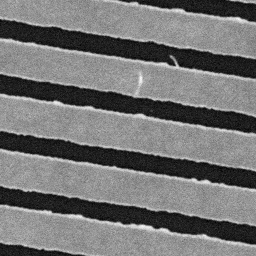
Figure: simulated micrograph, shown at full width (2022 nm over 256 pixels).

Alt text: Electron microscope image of lines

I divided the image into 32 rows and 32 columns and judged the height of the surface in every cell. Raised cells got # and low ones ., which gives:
#################...............
########################........
.##############################.
........########################
..............##################
####................############
###########...............######
################................
#######################.........
.############################...
........########################
..............##################
####...............#############
############..............######
##################.............#
########################........
.#############################..
........########################
..............##################
#####...............############
###########................#####
#################...............
#########################.......
.#############################..
........########################
...............#################
######................##########
############...............#####
###################.............
##########################......
.##############################.
........########################